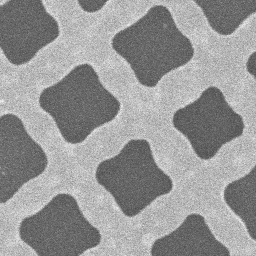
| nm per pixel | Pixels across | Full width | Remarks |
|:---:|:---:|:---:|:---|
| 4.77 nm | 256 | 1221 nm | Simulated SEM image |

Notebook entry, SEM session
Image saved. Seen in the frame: holes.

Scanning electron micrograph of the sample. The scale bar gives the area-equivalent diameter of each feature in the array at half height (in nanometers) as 328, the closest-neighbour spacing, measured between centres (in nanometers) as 440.